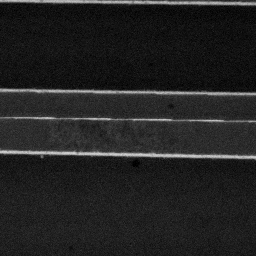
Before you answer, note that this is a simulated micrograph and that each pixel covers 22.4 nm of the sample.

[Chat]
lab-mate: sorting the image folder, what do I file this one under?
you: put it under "lines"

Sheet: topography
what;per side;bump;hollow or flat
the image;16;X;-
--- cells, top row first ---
----------------
----------------
----------------
----------------
----------------
----------------
XXXXXXXXXXXXXXXX
XXXXXXXXXXXXXXXX
XXXXXXXXXXXXXXXX
--XXXXXXXXXXXXXX
----------------
----------------
----------------
----------------
----------------
----------------